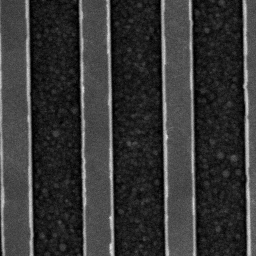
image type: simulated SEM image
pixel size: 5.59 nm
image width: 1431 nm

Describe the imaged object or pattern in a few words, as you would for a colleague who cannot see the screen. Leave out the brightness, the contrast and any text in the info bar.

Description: one or a few lines or trenches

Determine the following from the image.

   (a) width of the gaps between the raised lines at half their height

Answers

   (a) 0.301 microns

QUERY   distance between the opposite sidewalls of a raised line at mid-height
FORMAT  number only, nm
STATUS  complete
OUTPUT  156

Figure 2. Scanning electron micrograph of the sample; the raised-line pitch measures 457 nanometers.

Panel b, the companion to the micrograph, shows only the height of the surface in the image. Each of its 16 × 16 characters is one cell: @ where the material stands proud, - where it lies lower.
@@---@@---@@---@
@@---@@---@@---@
@@---@@---@@---@
@@---@@---@@---@
@@---@@---@@---@
@@---@@---@@---@
@@---@@---@@---@
@@---@@---@@---@
@@---@@---@@---@
@@---@@---@@---@
@@---@@---@@---@
@@---@@---@@---@
@@---@@---@@---@
@@---@@---@@----
@@---@@---@@----
@@---@@---@@----